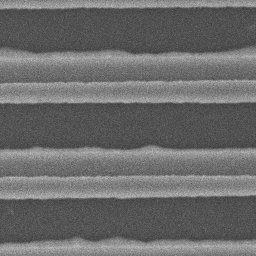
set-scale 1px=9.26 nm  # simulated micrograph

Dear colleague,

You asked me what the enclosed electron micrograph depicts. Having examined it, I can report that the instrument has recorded lines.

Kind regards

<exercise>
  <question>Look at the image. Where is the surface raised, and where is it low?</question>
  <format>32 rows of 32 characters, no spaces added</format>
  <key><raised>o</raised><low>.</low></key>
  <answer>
oooooooooooooooooooooooooooooooo
................................
................................
................................
................................
................................
................................
oooooooooooooooooooooooooooooooo
oooooooooooooooooooooooooooooooo
oooooooooooooooooooooooooooooooo
oooooooooooooooooooooooooooooooo
oooooooooooooooooooooooooooooooo
oooooooooooooooooooooooooooooooo
................................
................................
................................
................................
................................
................................
oooooooooooooooooooooooooooooooo
oooooooooooooooooooooooooooooooo
oooooooooooooooooooooooooooooooo
oooooooooooooooooooooooooooooooo
oooooooooooooooooooooooooooooooo
oooooooooooooooooooooo..o.......
................................
................................
................................
................................
................................
..............................o.
oooooooooooooooooooooooooooooooo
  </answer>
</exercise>